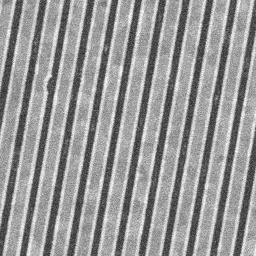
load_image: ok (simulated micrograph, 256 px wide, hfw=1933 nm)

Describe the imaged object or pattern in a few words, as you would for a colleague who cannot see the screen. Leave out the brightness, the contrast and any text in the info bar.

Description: parallel lines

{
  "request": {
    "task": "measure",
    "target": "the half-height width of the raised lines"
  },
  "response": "106 nanometers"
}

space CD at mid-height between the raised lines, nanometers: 73.4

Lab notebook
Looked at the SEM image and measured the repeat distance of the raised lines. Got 23.4 px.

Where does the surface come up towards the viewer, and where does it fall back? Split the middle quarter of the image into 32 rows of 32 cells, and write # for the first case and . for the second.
###..####..###...###...###...###
##...###...###...###...###...###
##...###...###...###...###...###
##...###..####..####..####..####
##..####..####..####..####..####
##..####..####..####..####..###.
##..####..###...###...###...###.
#...###...###...###...###...###.
#...###...###...###...###...###.
#...###...###..####..####..####.
#..####..####..####..####..####.
#..####..###...####..####..###..
...####..###...###...###...###..
...###...###...###...###...###..
...###...###...###...###...###..
...###...###..####..####..####..
..####..####..####..####..###...
..####..###...###...###...###...
..###...###...###...###...###...
..###...###...###...###...###...
..###...###..####...###...###..#
.####...###..####..####..####..#
.####..####..####..####..###...#
.####..###...###...###...###...#
.###...###...###...###...###...#
.###...###...###...###...###..##
.###...###..####..####..####..##
####..####..####..####..####..##
####..####..####..####..###...##
####..###...###...###...###...##
###...###...###...###...###...##
###...###...###...###...###..###